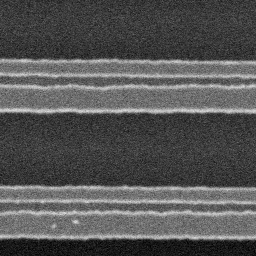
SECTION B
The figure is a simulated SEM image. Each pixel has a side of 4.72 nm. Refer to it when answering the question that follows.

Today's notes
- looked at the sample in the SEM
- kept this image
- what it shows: lines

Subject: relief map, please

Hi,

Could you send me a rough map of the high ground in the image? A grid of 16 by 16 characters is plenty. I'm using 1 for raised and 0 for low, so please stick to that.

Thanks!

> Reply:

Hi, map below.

0000000000000000
0000000000000000
0000000000000000
0000000000000000
1111111111111111
1111111111111111
1111111111111111
0000000000000000
0000000000000000
0000000000000000
0000000000000000
0000000000000000
1111111111111111
1111111111111111
1111111111111111
0000000000000000